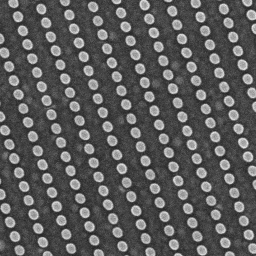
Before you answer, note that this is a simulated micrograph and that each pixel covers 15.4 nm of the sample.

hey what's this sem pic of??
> a regular array of raised bodies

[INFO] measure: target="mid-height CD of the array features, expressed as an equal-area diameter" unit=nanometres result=145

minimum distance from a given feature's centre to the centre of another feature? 0.226 microns